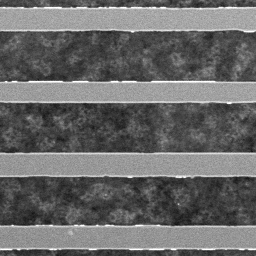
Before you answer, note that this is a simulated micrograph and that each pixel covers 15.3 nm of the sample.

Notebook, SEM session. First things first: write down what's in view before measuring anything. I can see one or a few lines or trenches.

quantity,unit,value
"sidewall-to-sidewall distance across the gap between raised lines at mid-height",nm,773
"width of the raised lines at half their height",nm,349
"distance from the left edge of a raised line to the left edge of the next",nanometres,1110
